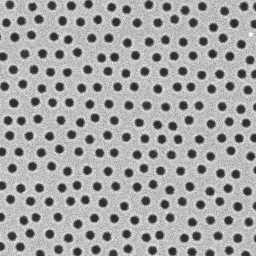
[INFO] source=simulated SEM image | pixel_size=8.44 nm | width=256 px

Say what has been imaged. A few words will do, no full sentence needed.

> a regular array of holes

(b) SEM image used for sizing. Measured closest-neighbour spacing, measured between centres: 134 nanometres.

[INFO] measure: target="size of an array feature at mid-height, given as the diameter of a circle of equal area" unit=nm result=80.3